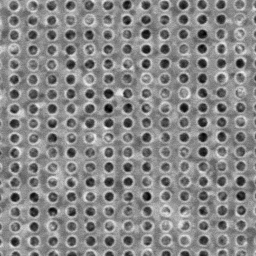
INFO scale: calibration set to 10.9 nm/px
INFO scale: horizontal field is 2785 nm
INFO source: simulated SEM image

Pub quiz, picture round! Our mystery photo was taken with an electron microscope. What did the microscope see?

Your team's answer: a regular array of holes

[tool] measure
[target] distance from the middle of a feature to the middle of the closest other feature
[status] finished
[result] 0.158 um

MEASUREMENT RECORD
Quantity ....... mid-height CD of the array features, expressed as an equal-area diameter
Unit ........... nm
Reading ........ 110